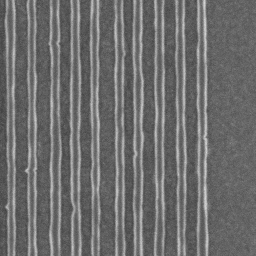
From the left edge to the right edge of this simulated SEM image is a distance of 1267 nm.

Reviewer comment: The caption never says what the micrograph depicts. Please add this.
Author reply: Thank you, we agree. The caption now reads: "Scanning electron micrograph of parallel lines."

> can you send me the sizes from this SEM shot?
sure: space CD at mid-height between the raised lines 66.9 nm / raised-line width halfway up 37.8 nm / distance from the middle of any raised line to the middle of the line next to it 105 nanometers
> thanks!